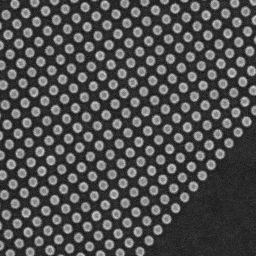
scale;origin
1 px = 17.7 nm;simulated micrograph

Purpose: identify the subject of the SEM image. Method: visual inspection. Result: a regular array of raised bodies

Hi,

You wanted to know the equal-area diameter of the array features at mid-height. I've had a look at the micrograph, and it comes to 147 nanometres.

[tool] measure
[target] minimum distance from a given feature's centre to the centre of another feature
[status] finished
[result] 246 nm